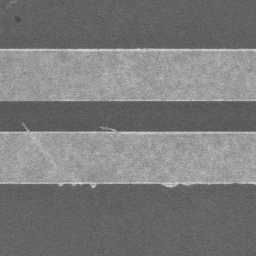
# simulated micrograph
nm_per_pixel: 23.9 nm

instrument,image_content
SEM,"lines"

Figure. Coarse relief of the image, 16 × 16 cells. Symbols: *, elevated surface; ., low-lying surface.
................
................
................
****************
****************
****************
................
................
****************
****************
****************
................
................
................
................
................